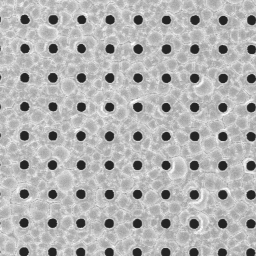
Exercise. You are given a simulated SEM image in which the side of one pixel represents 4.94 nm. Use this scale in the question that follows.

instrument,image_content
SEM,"a regular array of holes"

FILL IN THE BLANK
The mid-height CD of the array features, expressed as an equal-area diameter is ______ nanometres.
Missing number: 47.3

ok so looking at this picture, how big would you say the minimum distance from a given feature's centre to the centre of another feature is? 0.14 µm